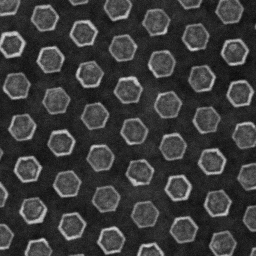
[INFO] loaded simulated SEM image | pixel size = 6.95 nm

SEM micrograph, a regular array of raised bodies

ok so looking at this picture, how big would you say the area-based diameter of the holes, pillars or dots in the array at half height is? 179 nanometers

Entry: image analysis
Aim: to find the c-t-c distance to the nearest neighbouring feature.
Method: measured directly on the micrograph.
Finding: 289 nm